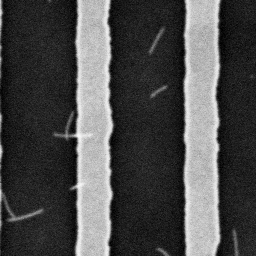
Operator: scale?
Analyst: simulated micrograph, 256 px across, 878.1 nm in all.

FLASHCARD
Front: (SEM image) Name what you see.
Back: lines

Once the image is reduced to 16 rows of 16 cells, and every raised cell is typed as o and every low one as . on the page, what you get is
.....oo.....oo..
.....oo.....oo..
.....oo.....oo..
.....oo.....oo..
.....oo.....oo..
.....oo.....o...
.....oo.....oo..
.....oo.....oo..
.....oo.....oo..
.....oo.....oo..
.....oo.....oo..
.....oo.....oo..
.....oo.....oo..
.....oo.....oo..
.....oo.....oo..
.....oo.....oo..